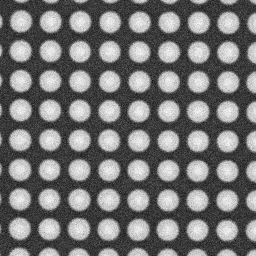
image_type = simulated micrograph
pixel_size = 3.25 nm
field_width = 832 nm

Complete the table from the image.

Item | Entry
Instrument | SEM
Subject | an array of small figures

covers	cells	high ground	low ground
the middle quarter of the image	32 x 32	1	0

00000000000000000000000000000000
00000000000000000000000000000000
00111100001110000111100011110000
01111100011111001111100011111001
01111110011111001111100011111001
00111100011111001111100011111001
00111100001110000111100001110000
00000000000000000000000000000000
00000000000000000000000000000000
00011000001110000011000001100000
00111100011111000111100011110001
01111100011111001111100011111001
01111100011111001111100011111001
00111100011110000111100011110001
00000000000000000000000000000000
00000000000000000000000000000000
00000000000000000000000000000000
00111100011110000111100011110000
01111100011111001111100011111001
01111110011111001111100011111001
00111100011111001111100011110001
00011000001110000111000001110000
00000000000000000000000000000000
00000000000000000000000000000000
00111100001110000111000001110000
00111100011111001111100011110001
01111100011111001111100011111001
01111100011111001111100011111001
00111100011110000111000011110001
00000000000000000000000000000000
00000000000000000000000000000000
00011000001100000000000000000000